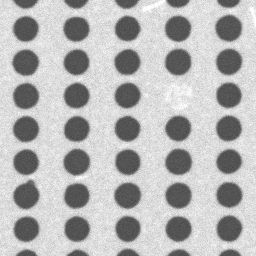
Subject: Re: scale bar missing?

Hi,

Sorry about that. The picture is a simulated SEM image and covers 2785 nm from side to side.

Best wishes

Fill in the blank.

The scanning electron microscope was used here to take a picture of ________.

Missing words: a regular array of holes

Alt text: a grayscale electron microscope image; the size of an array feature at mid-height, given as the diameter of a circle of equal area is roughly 281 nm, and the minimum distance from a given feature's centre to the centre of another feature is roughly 0.361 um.